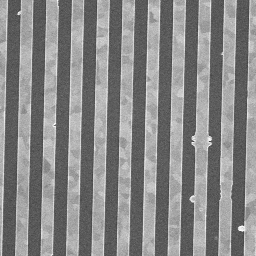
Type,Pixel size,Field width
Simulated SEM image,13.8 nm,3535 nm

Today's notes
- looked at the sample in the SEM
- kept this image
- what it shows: parallel lines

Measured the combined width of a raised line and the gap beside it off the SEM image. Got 351 nm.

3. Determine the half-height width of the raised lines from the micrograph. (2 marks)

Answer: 167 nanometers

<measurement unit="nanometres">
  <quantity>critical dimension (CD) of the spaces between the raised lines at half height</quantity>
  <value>186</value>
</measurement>